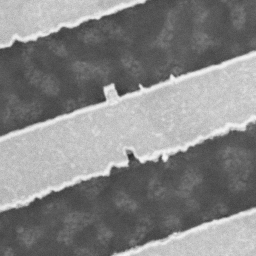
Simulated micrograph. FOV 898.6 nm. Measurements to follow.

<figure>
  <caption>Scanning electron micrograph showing one or a few lines or trenches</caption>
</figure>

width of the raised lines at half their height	224	nm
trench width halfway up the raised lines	300	nm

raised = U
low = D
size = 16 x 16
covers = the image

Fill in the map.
UUUUUUUDDDDDDDDD
UUUUUDDDDDDDDDDD
UDDDDDDDDDDDDDDD
DDDDDDDDDDDDDDDD
DDDDDDDDDDDDDUUU
DDDDDDDDDDUUUUUU
DDDDDDUUUUUUUUUU
DDDUUUUUUUUUUUUU
DUUUUUUUUUUUUDDD
UUUUUUUUUUUDDDDD
UUUUUUUDDDDDDDDD
UUUUDDDDDDDDDDDD
UUDDDDDDDDDDDDDD
DDDDDDDDDDDDDDDU
DDDDDDDDDDDDUUUU
DDDDDDDDDUUUUUUU